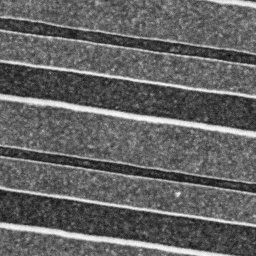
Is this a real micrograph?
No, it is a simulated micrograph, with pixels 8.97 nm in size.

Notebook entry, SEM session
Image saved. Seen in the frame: lines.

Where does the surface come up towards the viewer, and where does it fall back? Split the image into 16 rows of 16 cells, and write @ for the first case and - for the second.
@@@@@@@@@@@@@@@@
@@@@@@@@@@@@@@@@
@@@@@@@@@@@@@@@@
@@@@@@@@@@@@@@@@
-----@@@@@@@@@@@
------------@@@@
@@@@------------
@@@@@@@@@@------
@@@@@@@@@@@@@@@@
@@@@@@@@@@@@@@@@
@@@@@@@@@@@@@@@@
@@@@@@@@@@@@@@@@
-----@@@@@@@@@@@
------------@@@@
@@@-------------
@@@@@@@@@@------